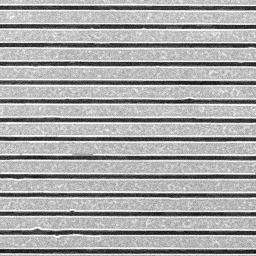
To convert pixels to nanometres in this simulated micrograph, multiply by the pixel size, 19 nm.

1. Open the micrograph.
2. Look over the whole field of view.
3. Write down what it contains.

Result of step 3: parallel lines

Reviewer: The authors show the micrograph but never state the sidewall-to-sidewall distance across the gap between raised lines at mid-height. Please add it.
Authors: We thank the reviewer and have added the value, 99.6 nm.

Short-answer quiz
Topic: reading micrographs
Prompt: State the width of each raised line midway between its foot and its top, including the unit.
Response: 254 nm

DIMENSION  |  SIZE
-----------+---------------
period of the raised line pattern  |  0.355 um